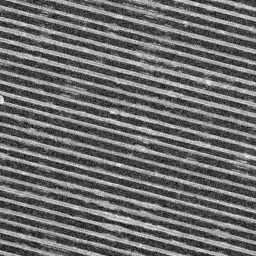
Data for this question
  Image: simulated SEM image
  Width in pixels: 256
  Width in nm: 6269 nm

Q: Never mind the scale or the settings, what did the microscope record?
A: parallel lines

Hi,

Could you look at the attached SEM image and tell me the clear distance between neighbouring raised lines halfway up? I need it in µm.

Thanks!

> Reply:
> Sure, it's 0.181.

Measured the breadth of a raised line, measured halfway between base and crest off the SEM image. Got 0.0711 micrometres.